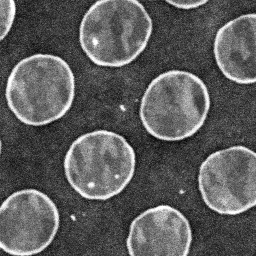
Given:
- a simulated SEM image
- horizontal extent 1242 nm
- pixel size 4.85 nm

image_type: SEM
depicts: raised bodies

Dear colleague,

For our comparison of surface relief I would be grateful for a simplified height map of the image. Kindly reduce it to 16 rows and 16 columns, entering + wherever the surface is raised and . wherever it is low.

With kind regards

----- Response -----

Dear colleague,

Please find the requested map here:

+.....+++.......
+....++++.....++
.....++++.....++
..+...++......++
.+++..........++
.++++....++++...
.+++.....++++...
.++......++++...
.....++...++....
....++++......++
....++++.....+++
.....+++.....+++
.++..........+++
++++.....++.....
+++.....++++....
+++.....++++....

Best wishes